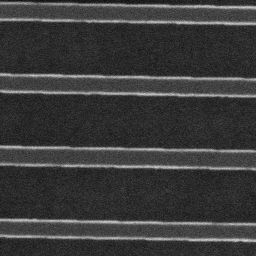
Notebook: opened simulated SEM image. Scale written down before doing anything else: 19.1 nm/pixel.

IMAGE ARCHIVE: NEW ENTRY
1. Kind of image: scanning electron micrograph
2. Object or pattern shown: lines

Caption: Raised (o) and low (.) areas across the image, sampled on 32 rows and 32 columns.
oooooooooo......................
oooooooooooooooooooooooooooooooo
oooooooooooooooooooooooooooooooo
................................
................................
................................
................................
................................
................................
ooooooooooooo...................
oooooooooooooooooooooooooooooooo
oooooooooooooooooooooooooooooooo
................................
................................
................................
................................
................................
................................
ooooooooo.......................
oooooooooooooooooooooooooooooooo
oooooooooooooooooooooooooooooooo
................................
................................
................................
................................
................................
................................
ooooo...........................
oooooooooooooooooooooooooooooooo
oooooooooooooooooooooooooooooooo
................................
................................